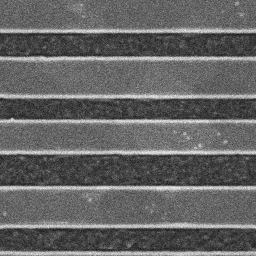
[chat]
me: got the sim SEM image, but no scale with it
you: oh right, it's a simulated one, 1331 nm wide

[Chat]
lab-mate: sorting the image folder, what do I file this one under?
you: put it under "one or a few lines or trenches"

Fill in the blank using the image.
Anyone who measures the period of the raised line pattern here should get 338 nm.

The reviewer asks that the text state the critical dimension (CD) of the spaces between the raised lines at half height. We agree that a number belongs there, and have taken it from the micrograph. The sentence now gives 137 nm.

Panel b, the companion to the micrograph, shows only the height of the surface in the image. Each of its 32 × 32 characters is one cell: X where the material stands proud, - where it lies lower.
XXXXXXXXXXXXXXXXXXXXXXXXXXXXXXXX
XXXXXXXXXXXXXXXXXXXXXXXXXXXXXXXX
XXXXXXXXXXXXXXXXXXXXXXXXXXXXXXXX
XXXXXXXXXXXXXXXXXXXXXXXXXXXXXXXX
--------------------------------
--------------------------------
--------------------------------
XXXXXXXXXXXXXXXXXXXXXXXXXXXXXXXX
XXXXXXXXXXXXXXXXXXXXXXXXXXXXXXXX
XXXXXXXXXXXXXXXXXXXXXXXXXXXXXXXX
XXXXXXXXXXXXXXXXXXXXXXXXXXXXXXXX
XXXXXXXXXXXXXXXXXXXXXXXXXXXXXXXX
--------------------------------
--------------------------------
--------------------------------
XXXXXXXXXXXXXXXXXXXXXXXXXXXXXXXX
XXXXXXXXXXXXXXXXXXXXXXXXXXXXXXXX
XXXXXXXXXXXXXXXXXXXXXXXXXXXXXXXX
XXXXXXXXXXXXXXXXXXXXXXXXXXXXXXXX
--------------------------------
--------------------------------
--------------------------------
--------------------------------
XXXXXXXXX---X---X---XX----------
XXXXXXXXXXXXXXXXXXXXXXXXXXXXXXXX
XXXXXXXXXXXXXXXXXXXXXXXXXXXXXXXX
XXXXXXXXXXXXXXXXXXXXXXXXXXXXXXXX
XXXXXXXXXXXXXXXXXXXXXXXXXXXXXXXX
--------------------------------
--------------------------------
--------------------------------
--------------------------------